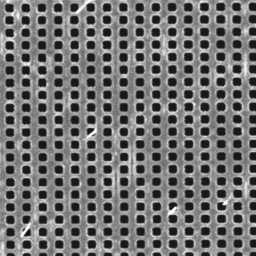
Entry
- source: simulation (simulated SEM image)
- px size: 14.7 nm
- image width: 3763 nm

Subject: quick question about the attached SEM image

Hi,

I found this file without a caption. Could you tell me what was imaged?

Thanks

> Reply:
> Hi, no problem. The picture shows a regular array of holes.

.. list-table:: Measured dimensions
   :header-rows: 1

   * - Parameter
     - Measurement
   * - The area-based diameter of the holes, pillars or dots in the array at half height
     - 141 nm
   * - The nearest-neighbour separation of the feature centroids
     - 182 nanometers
